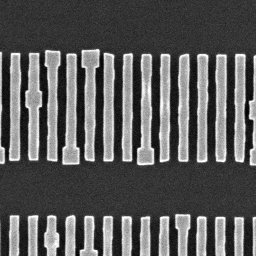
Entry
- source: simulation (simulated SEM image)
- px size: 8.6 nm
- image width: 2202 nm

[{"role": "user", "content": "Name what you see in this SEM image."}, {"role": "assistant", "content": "wiring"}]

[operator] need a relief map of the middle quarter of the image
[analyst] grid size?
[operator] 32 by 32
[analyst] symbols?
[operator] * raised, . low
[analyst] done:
.**..****.**...**..***..**...**.
.**...**..**...**..***..**...**.
.**...**..**...**...**..**...**.
.**...**..**...**...**..**...**.
.**...**..**...**...**..**...**.
.**..***..**...**...**..**...**.
.**..***..**...**...**..**...**.
.**..***..**...**...**..**...**.
.**..***..**...**..***..**...**.
.**..***..**...**..***..**...**.
.**..***..**...**..***..**...**.
.**..***..**...**..***..**...**.
.**..***..**...**..***..**...**.
.**..***..**...**..***..**...**.
.**..***..**...**..***..**...**.
.**..***..**...**..***..**...**.
.**..**...**...**..***..**...**.
.**...*...**...**..***..**...**.
.**...*...**...**..***..**...**.
.**...*...**...**..***..**...**.
***..**...**...**..***..**...**.
****.**...**...**.****..**...**.
****.**...**...**.****..**...**.
****.**...**...**.****..**...**.
****..............****..........
................................
................................
................................
................................
................................
................................
................................